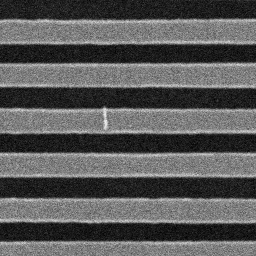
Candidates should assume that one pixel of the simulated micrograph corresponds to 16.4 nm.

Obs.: lines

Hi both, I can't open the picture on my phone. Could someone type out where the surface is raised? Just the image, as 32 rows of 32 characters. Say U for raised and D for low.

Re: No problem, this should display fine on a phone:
DDDDDDDDDDDDDDDDDDDDDDDDDDDDDDDD
DDDDDDDDDDDDDDDDDDDDDDDDDDDDDDDD
DUUDDUDDDDDDDDDDDDDDUDUDUUUUUUUU
UUUUUUUUUUUUUUUUUUUUUUUUUUUUUUUU
UUUUUUUUUUUUUUUUUUUUUUUUUUUUUUUU
DDDDDDDDDDDDDDDDDDDDDDDDDDDDDDDD
DDDDDDDDDDDDDDDDDDDDDDDDDDDDDDDD
DDDDDDDDDDDDDDDDDDDDDDDDDDDDDDDD
UUUUUUUUUUUUUUUUUUUUUUUUUUUUUUUU
UUUUUUUUUUUUUUUUUUUUUUUUUUUUUUUU
UUUUUUUUUUUUUUUUUUUUUUUUUUUUUUUU
DDDDDDDDDDDDDDDDDDDDDDDDDDDDDDDD
DDDDDDDDDDDDDDDDDDDDDDDDDDDDDDDD
DDDDDDDDDDDDDDDDDDDDDDDDDDDDDDDD
UUUUUUUUUUUUUUUUUUUUUUUUUUUUUUUU
UUUUUUUUUUUUUUUUUUUUUUUUUUUUUUUU
UUUUUUUUUUUUUUUUUUUUUUUUUUUUUUUU
DDDDDDDDDDDDDDDDDDDDDDDDDDDDDDDD
DDDDDDDDDDDDDDDDDDDDDDDDDDDDDDDD
UUUUUUUUUUUUUUUUUUUUUUUUUUUUUUUU
UUUUUUUUUUUUUUUUUUUUUUUUUUUUUUUU
UUUUUUUUUUUUUUUUUUUUUUUUUUUUUUUU
DDDDDDDDDDDDDDDDDDDDDDDDDDDDDDDD
DDDDDDDDDDDDDDDDDDDDDDDDDDDDDDDD
DDDDDDDDDDDDDDDDDDDDDDDDDDDDDDDD
UUUUUUUUUUUUUUUUUUUUUUUUUUUUUUUU
UUUUUUUUUUUUUUUUUUUUUUUUUUUUUUUU
UUUUUUUUUUUUUUUUUUUUUUUUUUUUUUUU
DDDDDDDDDDDDDDDDDDDDDDDDDDDDDDDD
DDDDDDDDDDDDDDDDDDDDDDDDDDDDDDDD
UUUUUUUUUUUUUUUUUUUUUUUUUUUUUUUU
UUUUUUUUUUUUUUUUUUUUUUUUUUUUUUUU